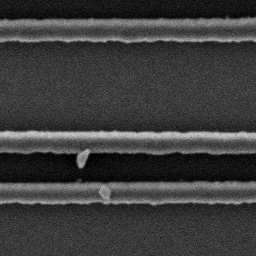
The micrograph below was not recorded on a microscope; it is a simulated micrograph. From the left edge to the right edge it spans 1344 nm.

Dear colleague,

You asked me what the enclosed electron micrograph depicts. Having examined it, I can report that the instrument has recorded lines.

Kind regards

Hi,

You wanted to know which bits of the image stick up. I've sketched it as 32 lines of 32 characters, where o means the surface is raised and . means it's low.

................................
................................
...........o.......oo.....oo.ooo
oooooooooooooooooooooooooooooooo
oooooooooooooooooooooooooooooooo
................................
................................
................................
................................
................................
................................
................................
................................
................................
................................
................................
................................
oooooooooooooooooooooooooooooooo
oooooooooooooooooooooooooooooooo
..........o.....................
..........o.....................
................................
................................
oooooooooooooooooooooooooooooooo
oooooooooooooooooooooooooooooooo
...................o............
................................
................................
................................
................................
................................
................................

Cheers